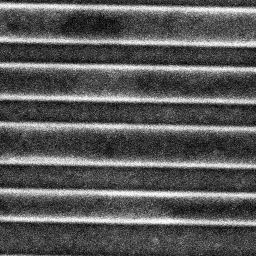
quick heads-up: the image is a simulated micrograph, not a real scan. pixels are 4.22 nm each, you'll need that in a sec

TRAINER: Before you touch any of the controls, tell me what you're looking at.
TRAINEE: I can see parallel lines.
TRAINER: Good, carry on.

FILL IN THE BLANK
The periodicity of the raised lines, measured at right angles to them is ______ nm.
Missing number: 256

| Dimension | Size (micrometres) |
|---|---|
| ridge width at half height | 0.153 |